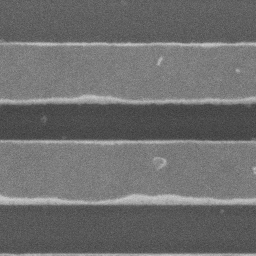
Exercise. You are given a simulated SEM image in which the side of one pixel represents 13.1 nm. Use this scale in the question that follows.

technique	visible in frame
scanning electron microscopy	lines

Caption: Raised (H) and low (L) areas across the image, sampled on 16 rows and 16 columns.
LLLLLLLLLLLLLLLL
LLLLLLLLLLLLLLLL
LLLLLLLLLLLLLLLL
HHHHHHHHHHHHHHHH
HHHHHHHHHHHHHHHH
HHHHHHHHHHHHHHHH
LLLLLLLLLLLLLLLL
LLLLLLLLLLLLLLLL
LLLLLLLLLLLLLLLL
HHHHHHHHHHHHHHHH
HHHHHHHHHHHHHHHH
HHHHHHHHHHHHHHHH
HHHHHHHHHHHHHHHH
LLLLLLLLLLLLLLLL
LLLLLLLLLLLLLLLL
LLLLLLLLLLLLLLLL